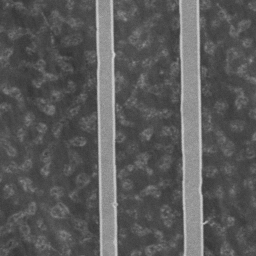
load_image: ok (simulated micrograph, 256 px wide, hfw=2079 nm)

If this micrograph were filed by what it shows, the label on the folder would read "one or a few lines or trenches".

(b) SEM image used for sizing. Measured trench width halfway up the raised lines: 560 nanometers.